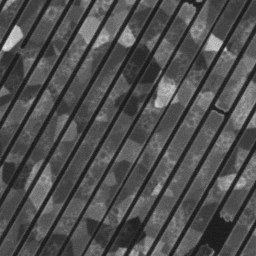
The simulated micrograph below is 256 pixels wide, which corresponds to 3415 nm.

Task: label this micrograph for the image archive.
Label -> parallel lines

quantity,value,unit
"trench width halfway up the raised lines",62.2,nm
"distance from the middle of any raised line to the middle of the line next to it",258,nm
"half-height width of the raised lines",194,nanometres